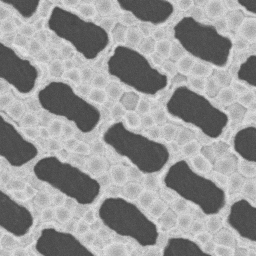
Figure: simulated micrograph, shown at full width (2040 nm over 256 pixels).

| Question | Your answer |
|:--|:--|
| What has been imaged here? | a regular array of holes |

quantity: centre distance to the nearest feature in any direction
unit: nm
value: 561